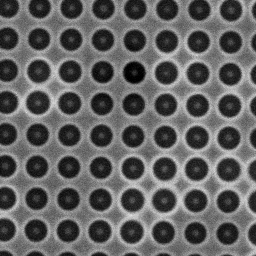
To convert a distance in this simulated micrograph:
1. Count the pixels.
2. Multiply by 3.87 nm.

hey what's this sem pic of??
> an array of small figures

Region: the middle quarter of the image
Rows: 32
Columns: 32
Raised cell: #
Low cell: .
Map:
....###.....###.....###.....###.
.....##.....###......#.......#..
....###.....###......#.......#..
....###.....###.....###......##.
...#####...#####...####.....###.
################################
################################
...#####...#####...#####...#####
....###.....###.....###.....###.
....###.....###.....###.....##..
....###.....###.....##.......#..
....###.....###.....###.....###.
...#####...#####...#####....###.
################################
################################
...#####...#####..######...#####
....###.....###.....###.....###.
....##......###.....##......##..
....##......##......##......##..
....###.....###.....###.....##..
...#####...#####...####....####.
################################
################################
...#####...#####...####....#####
....###.....###.....##......###.
....##......##......##......##..
....##......##.......#.......#..
....###.....###.....##......##..
..######...####....####.....###.
########################..######
################################
...####....####....####....####.